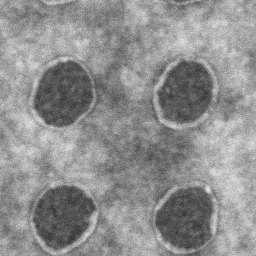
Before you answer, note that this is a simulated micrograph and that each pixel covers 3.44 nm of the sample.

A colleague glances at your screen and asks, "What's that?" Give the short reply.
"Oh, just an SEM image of raised bodies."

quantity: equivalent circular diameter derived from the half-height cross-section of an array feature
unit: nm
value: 233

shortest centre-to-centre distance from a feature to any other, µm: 0.422